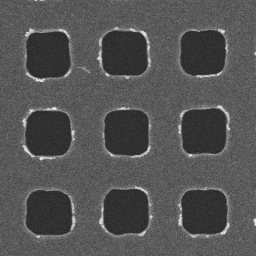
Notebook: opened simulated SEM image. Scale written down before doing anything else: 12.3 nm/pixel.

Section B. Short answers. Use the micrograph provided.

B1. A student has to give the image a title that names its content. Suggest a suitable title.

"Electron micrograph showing a regular array of holes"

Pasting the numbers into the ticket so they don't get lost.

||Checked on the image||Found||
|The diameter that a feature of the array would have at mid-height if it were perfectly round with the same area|0.603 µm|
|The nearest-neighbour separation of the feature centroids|957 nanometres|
